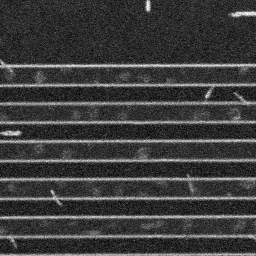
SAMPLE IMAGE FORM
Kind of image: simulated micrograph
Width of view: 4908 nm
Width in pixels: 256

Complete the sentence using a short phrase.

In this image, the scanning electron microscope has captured parallel lines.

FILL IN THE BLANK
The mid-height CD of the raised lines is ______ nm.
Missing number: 381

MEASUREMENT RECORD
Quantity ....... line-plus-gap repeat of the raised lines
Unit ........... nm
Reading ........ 727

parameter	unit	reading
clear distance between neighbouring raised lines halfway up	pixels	17.9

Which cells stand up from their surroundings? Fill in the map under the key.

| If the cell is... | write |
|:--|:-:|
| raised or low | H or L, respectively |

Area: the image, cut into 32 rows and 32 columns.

LLLLLLLLLLLLLLLLLLLLLLLLLLLLLLLL
LLLLLLLLLLLLLLLLLLLLLLLLLLLLLLLL
LLLLLLLLLLLLLLLLLLLLLLLLLLLLLLLL
LLLLLLLLLLLLLLLLLLLLLLLLLLLLLLLL
LLLLLLLLLLLLLLLLLLLLLLLLLLLLLLLL
LLLLLLLLLLLLLLLLLLLLLLLLLLLLLLLL
LLLLLLLLLLLLLLLLLLLLLLLLLLLLLLLL
LLLLLLLLLLLLLLLLLLLLLLLLLLLLLLLL
HHHHHHHHHHHHHHHHHHHHHHHHHHHHHHHH
HHHHHHHHHHHHHHHHHHHHHHHHHHHHHHHH
HHHHHHHHHHHHHHHHHHHHHHHHHHHHHHHH
LLLLLLLLLLLLLLLLLLLLLLLLLLLLLLLL
LLLLLLLLLLLLLLLLLLLLLLLLLLLLLLLL
HHHHHHHHHHHHHHHHHHHHHHHHHHHHHHHH
HHHHHHHHHHHHHHHHHHHHHHHHHHHHHHHH
LLLLLLLLLLLLLLLLLLLLLLLLLLLLLLLL
LLLLLLLLLLLLLLLLLLLLLLLLLLLLLLLL
LLLLLLLLLLLLLLLLLLLLLLLLLLLLLLLL
HHHHHHHHHHHHHHHHHHHHHHHHHHHHHHHH
HHHHHHHHHHHHHHHHHHHHHHHHHHHHHHHH
LLLLLLLLLLLLLLLLLLLLLLLLLLLLLLLL
LLLLLLLLLLLLLLLLLLLLLLLLLLLLLLLL
LLLLLLLLHHHHHHHHHHHHHHHHHHHHHHHH
HHHHHHHHHHHHHHHHHHHHHHHHHHHHHHHH
HHHHHHHHHHHHHHHHHHHHHHHHHHHHHHHH
LLLLLLLLLLLLLLLLLLLLLLLLLLLLLLLL
LLLLLLLLLLLLLLLLLLLLLLLLLLLLLLLL
HHHHHHHHHHHHHHHHHHHHHHHHHHHHHHHH
HHHHHHHHHHHHHHHHHHHHHHHHHHHHHHHH
HHHHHHHHHHHHHHHHHHHHHHHHHHHHHHLH
LLLLLLLLLLLLLLLLLLLLLLLLLLLLLLLL
LLLLLLLLLLLLLLLLLLLLLLLLLLLLLLLL